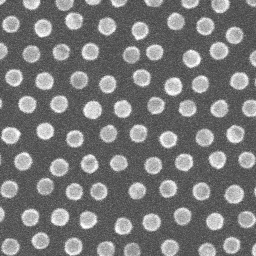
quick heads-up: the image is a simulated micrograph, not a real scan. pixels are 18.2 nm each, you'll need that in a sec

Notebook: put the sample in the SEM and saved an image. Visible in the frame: a regular array of raised bodies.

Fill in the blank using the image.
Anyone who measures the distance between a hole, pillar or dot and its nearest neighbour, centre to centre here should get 519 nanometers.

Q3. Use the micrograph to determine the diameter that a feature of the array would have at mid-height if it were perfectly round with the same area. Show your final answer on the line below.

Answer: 292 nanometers